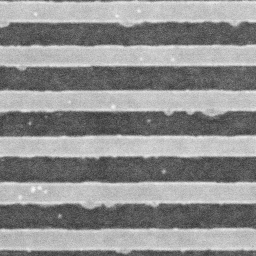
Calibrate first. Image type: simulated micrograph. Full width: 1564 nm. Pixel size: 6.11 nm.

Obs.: lines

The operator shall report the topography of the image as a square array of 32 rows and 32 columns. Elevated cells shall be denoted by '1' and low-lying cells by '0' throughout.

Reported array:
11111111111111111111111111111111
11111111111111111111111111111111
11111111111111111111111111111111
00000000000000000000000000000000
00000000000000000000000000000000
00000000000000000000000000000000
11111111111111111111111111111111
11111111111111111111111111111111
00100000000000000000000000000000
00000000000000000000000000000000
00000000000000000000000000000000
11111111111111111111111111111111
11111111111111111111111111111111
11111111111111111111111111111111
00000000000000000000000000000000
00000000000000000000000000000000
00000000000000000000000000000000
11111111111111111111111111111111
11111111111111111111111111111111
00110000111110000000001100000000
00000000000000000000000000000000
00000000000000000000000000000000
00000000000000000000000000000000
11111111111111111111111111111111
11111111111111111111111111111111
00000000001111000001000000000000
00000000000000000000000000000000
00000000000000000000000000000000
00000000000000000000000000000000
11111111111111111111111111111111
11111111111111111111111111111111
00000000000000010000000000000000